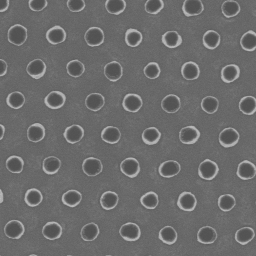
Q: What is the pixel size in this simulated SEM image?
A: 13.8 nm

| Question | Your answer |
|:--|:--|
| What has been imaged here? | a regular array of raised bodies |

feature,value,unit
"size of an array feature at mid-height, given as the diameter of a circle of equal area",250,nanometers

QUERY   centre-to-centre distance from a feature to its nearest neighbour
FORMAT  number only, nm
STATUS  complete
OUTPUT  514